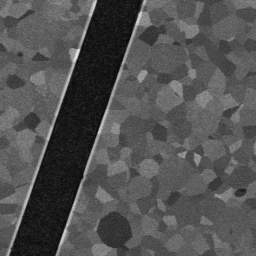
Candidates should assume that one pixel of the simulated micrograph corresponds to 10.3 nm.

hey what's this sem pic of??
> one or a few lines or trenches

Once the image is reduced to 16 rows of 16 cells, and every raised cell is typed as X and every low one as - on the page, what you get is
XXXXXX---XXXXXXX
XXXXXX---XXXXXXX
XXXXX---XXXXXXXX
XXXXX---XXXXXXXX
XXXX---XXXXXXXXX
XXXX---XXXXXXXXX
XXXX---XXXXXXXXX
XXX---XXXXXXXXXX
XXX---XXXXXXXXXX
XXX---XXXXXXXXXX
XX---XXXXXXXXXXX
XX---XXXXXXXXXXX
XX---XXXXXXXXXXX
X---XXXXXXXXXXXX
X---XXXXXXXXXXXX
X---XXXXXXXXXXXX